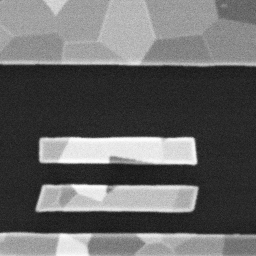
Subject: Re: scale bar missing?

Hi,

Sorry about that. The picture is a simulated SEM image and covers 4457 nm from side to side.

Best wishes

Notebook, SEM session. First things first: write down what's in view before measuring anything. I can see wiring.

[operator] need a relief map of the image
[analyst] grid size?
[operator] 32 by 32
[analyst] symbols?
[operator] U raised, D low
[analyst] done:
UUUUUUUUUUUUUUUUUUUUUUUUUUUUUUUU
UUUUUUUUUUUUUUUUUUUUUUUUUUUUUUUU
UUUUUUUUUUUUUUUUUUUUUUUUUUUUUUUU
UUUUUUUUUUUUUUUUUUUUUUUUUUUUUUUU
UUUUUUUUUUUUUUUUUUUUUUUUUUUUUUUU
UUUUUUUUUUUUUUUUUUUUUUUUUUUUUUUU
UUUUUUUUUUUUUUUUUUUUUUUUUUUUUUUU
UUUUUUUUUUUUUUUUUUUUUUUUUUUUUUUU
DDDDDDDDDDDDDDDDDDDDDDDDDDDDDDDD
DDDDDDDDDDDDDDDDDDDDDDDDDDDDDDDD
DDDDDDDDDDDDDDDDDDDDDDDDDDDDDDDD
DDDDDDDDDDDDDDDDDDDDDDDDDDDDDDDD
DDDDDDDDDDDDDDDDDDDDDDDDDDDDDDDD
DDDDDDDDDDDDDDDDDDDDDDDDDDDDDDDD
DDDDDDDDDDDDDDDDDDDDDDDDDDDDDDDD
DDDDDDDDDDDDDDDDDDDDDDDDDDDDDDDD
DDDDDDDDDDDDDDDDDDDDDDDDDDDDDDDD
DDDDDUUUUUUUUUUUUUUUUUUUDDDDDDDD
DDDDDUUUUUUUUUUUUUUUUUUUDDDDDDDD
DDDDDUUUUUUUUUUUUUUUUUUUDDDDDDDD
DDDDDDDDDDDDDDDDDDDDDDDDDDDDDDDD
DDDDDDDDDDDDDDDDDDDDDDDDDDDDDDDD
DDDDDDDDDDDDDDDDDDDDDDDDDDDDDDDD
DDDDDUUUUUUUUUUUUUUUUUUUDDDDDDDD
DDDDDUUUUUUUUUUUUUUUUUUUUDDDDDDD
DDDDDUUUUUUUUUUUUUUUUUUUDDDDDDDD
DDDDDDDDDDDDDDDDDDDDDDDDDDDDDDDD
DDDDDDDDDDDDDDDDDDDDDDDDDDDDDDDD
DDDDDDDDDDDDDDDDDDDDDDDDDDDDDDDD
UUUUUUUUUUUUUUUUUUUUUUUUUUUUUUUU
UUUUUUUUUUUUUUUUUUUUUUUUUUUUUUUU
UUUUUUUUUUUUUUUUUUUUUUUUUUUUUUUU